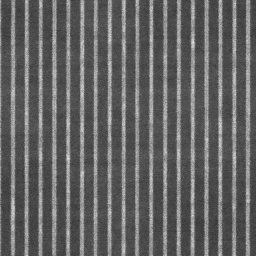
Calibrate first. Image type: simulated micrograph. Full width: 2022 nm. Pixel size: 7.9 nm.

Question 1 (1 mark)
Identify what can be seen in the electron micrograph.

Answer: parallel lines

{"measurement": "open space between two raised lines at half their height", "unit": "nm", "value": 86.9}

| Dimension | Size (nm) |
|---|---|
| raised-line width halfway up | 23.7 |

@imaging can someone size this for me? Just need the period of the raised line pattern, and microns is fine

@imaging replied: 0.109